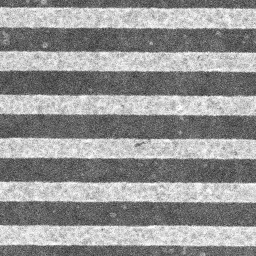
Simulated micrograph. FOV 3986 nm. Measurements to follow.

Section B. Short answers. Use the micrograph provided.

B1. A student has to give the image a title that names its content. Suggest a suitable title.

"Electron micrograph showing parallel lines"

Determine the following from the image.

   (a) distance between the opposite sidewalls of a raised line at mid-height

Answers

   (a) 280 nm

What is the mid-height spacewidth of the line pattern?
0.391 micrometres